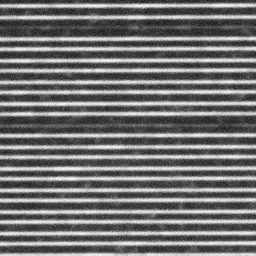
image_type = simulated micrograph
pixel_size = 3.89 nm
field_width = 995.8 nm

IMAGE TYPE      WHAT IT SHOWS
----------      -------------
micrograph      parallel lines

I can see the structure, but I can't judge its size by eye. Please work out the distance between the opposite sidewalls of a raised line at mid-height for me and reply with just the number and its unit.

5.8 nm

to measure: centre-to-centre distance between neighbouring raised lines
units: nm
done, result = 42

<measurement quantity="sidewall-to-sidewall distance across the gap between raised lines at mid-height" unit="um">0.0369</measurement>